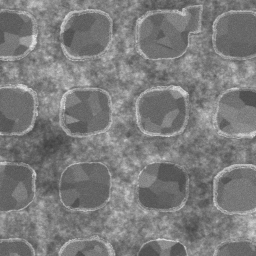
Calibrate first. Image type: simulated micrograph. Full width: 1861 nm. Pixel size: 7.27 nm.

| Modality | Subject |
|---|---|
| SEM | raised bodies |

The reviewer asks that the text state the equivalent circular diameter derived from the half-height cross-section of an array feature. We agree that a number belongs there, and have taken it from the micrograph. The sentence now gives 53.9 pixels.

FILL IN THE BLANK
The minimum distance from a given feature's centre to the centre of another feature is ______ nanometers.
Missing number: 558